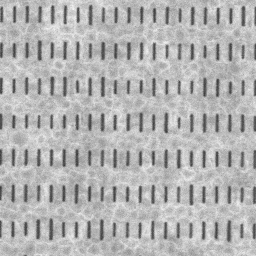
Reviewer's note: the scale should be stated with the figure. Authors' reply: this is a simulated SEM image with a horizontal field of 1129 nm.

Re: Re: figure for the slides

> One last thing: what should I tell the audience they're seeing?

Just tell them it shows a regular array of holes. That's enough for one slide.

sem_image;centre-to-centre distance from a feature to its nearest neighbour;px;12.6